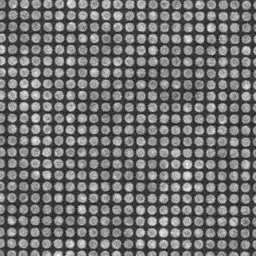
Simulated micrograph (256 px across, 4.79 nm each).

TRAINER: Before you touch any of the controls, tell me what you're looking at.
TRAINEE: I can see a regular array of raised bodies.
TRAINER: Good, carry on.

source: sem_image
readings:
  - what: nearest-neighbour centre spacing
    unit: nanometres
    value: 53.6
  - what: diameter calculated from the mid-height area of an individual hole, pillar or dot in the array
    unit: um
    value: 0.0422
